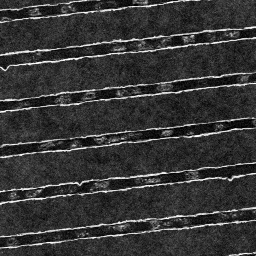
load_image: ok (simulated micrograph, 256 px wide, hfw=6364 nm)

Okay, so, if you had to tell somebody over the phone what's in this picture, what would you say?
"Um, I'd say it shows parallel lines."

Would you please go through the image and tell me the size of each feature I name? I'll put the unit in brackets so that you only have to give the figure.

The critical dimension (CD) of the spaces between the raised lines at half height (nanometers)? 266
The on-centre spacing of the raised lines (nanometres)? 1120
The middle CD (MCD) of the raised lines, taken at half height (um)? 0.861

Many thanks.